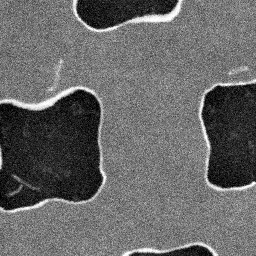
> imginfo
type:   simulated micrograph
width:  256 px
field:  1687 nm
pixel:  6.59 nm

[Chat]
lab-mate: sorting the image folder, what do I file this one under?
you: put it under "holes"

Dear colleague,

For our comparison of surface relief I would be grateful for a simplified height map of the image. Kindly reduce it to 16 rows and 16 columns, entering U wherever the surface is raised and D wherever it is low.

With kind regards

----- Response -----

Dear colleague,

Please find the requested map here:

UUUUUDDDDDDUUUUU
UUUUUDDDUUUUUUUU
UUUUUUUUUUUUUUUU
UUUUUUUUUUUUUUUU
UUUUUUUUUUUUUUUU
UUUUUUUUUUUUUDDD
DUUDDDUUUUUUUDDD
DDDDDDUUUUUUUDDD
DDDDDDUUUUUUUDDD
DDDDDDUUUUUUUDDD
DDDDDDUUUUUUUDDD
DDDDDDUUUUUUUDDD
DDDUDUUUUUUUUUUU
UUUUUUUUUUUUUUUU
UUUUUUUUUUUUUUUU
UUUUUUUUUUUDDUUU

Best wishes